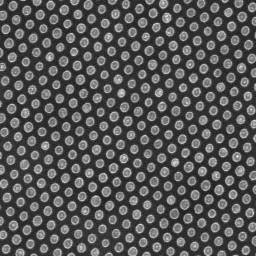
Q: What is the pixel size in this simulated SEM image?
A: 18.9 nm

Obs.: a regular array of raised bodies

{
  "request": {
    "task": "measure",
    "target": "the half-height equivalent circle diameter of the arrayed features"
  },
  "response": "163 nm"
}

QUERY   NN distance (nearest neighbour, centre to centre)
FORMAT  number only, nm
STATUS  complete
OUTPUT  265